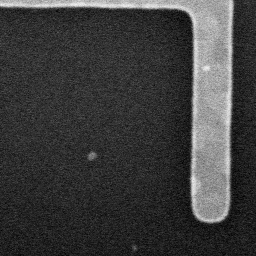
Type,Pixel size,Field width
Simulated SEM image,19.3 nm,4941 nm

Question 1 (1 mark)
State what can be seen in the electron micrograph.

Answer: wiring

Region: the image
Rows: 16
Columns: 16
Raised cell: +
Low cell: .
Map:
...........+++..
............++..
............++..
............++..
............++..
............++..
............++..
............++..
............++..
............++..
............++..
............++..
............++..
............++..
................
................